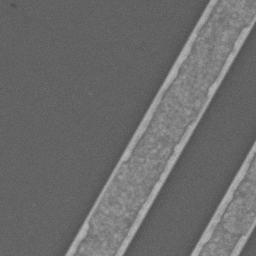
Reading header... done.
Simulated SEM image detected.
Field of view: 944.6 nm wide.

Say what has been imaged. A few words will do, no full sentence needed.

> one or a few lines or trenches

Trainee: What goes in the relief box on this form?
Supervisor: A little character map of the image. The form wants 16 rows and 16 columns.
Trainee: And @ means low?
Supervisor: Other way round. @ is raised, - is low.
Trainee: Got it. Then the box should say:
-------------@@@
------------@@@@
------------@@@-
-----------@@@@-
-----------@@@--
----------@@@@--
----------@@@---
---------@@@----
--------@@@@----
--------@@@-----
-------@@@@----@
-------@@@-----@
------@@@@----@@
------@@@----@@@
-----@@@-----@@@
----@@@@----@@@-